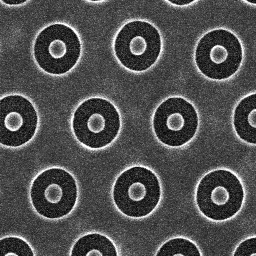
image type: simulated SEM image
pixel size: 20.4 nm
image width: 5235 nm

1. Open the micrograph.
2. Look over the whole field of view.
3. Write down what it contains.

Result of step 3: a regular array of ring-shaped grooves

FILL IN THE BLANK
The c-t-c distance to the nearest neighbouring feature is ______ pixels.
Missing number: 80.3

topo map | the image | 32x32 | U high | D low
UDDUUUUUUUUUUUUUUUUUUUDDUUUUUUUU
UUUUUUUUUUUUUUUUUUUUUUUUUUUUUUUU
UUUUUUUUUUUUUUUUUUUUUUUUUUUUUUUU
UUUUUUDDDUUUUUUDDDDUUUUUUUUUUUUU
UUUUUDDDDDUUUUDDDDDDUUUUUDDDDUUU
UUUUDDUUDDUUUUDDUUDDUUUUUDDDDDUU
UUUUDDUUDDUUUUDDDUDDUUUUDDUUDDUU
UUUUUDDDDDUUUUUDDDDDUUUUDDDUDDUU
UUUUUDDDDUUUUUUUDDUUUUUUUDDDDDUU
UUUUUUUUUUUUUUUUUUUUUUUUUUDDDUUU
UUUUUUUUUUUUUUUUUUUUUUUUUUUUUUUU
UUUUUUUUUUUUUUUUUUUUUUUUUUUUUUUU
DDDDUUUUUUUDDUUUUUUUUDDUUUUUUUDD
DDDDUUUUUUDDDDUUUUUUDDDDUUUUUDDD
DUDDDUUUUDDUUDDUUUUDDUUDDUUUUDDU
DUUDDUUUUDDUUDDUUUUDDUUDDUUUUDDU
DDDDUUUUUDDDDDDUUUUDDDDDUUUUUUDD
DDDDUUUUUUDDDDUUUUUUDDDDUUUUUUDD
UUUUUUUUUUUDDUUUUUUUUUUUUUUUUUUU
UUUUUUUUUUUUUUUUUUUUUUUUUUUUUUUU
UUUUUUUUUUUUUUUUUUUUUUUUUUUUUUUU
UUUUUDDDUUUUUUUDDDDUUUUUUUDDDUUU
UUUUDDDDDUUUUUUDDDDDUUUUUDDDDDUU
UUUUDDUDDDUUUUDDUUDDUUUUUDDUDDUU
UUUUDDUUDDUUUUDDUUDDUUUUUDUUDDUU
UUUUDDDDDUUUUUDDDDDDUUUUUDDUDDUU
UUUUUDDDDUUUUUUDDDDUUUUUUDDDDDUU
UUUUUUUUUUUUUUUUUUUUUUUUUUUDUUUU
UUUUUUUUUUUUUUUUUUUUUUUUUUUUUUUU
UUUUUUUUUUUDDUUUUUUUUUUUUUUUUUUU
DDDUUUUUUDDDDDUUUUUUUDDDUUUUUUDD
DDDDUUUUUDDUDDDUUUUUDDDDDUUUUDDD